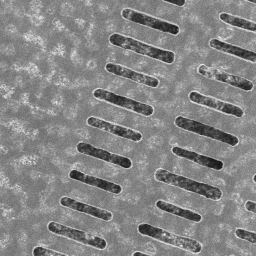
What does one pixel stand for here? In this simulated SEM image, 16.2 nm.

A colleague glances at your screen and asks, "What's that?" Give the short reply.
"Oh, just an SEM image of a regular array of holes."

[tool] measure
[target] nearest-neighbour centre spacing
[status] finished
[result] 28 px